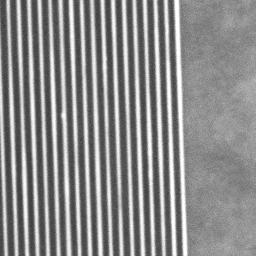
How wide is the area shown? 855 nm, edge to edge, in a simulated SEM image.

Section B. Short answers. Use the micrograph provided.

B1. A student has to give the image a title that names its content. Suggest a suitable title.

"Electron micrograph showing parallel lines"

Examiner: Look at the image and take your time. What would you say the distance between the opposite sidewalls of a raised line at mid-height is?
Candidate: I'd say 8.8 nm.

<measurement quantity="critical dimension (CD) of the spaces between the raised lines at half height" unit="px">8.11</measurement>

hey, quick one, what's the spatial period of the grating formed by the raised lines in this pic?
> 0.0351 um